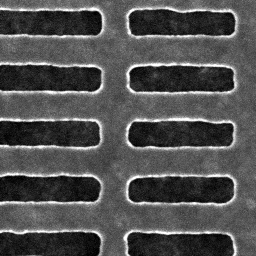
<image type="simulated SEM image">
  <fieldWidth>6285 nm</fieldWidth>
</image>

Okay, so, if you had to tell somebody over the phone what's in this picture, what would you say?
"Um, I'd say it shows holes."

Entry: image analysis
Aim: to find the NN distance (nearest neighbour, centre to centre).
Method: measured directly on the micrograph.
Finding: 1360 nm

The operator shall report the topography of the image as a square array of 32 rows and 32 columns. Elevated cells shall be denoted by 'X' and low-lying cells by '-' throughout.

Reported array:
XXXXXXXXXXXXXXXXXXXXXXXXXXXXXXXX
------------XXXX------XX-----XXX
-------------XXX-------------XXX
-------------XXX-------------XXX
XXXXXXX-----XXXXX-XXXXXXXX--XXXX
XXXXXXXXXXXXXXXXXXXXXXXXXXXXXXXX
XXXXXXXXXXXXXXXXXXXXXXXXXXXXXXXX
XXXXXXXXXXXXXXXXXXXXXXXXXXXXXXXX
------------XXXXX------------XXX
-------------XXX-------------XXX
-------------XXX-------------XXX
XXXXXXXXX--XXXXXX------XXX--XXXX
XXXXXXXXXXXXXXXXXXXXXXXXXXXXXXXX
XXXXXXXXXXXXXXXXXXXXXXXXXXXXXXXX
XXXXXXXXXXXXXXXXXXXXXXXXXXXXXXXX
------------XXXX-------------XXX
-------------XXX-------------XXX
-------------XXX-------------XXX
XXXXXXXXX-XXXXXXXXXXXXXXXXXXXXXX
XXXXXXXXXXXXXXXXXXXXXXXXXXXXXXXX
XXXXXXXXXXXXXXXXXXXXXXXXXXXXXXXX
XXXXXXXXXXXXXXXXXXXXXXXXXXXXXXXX
------------XXXXX------------XXX
-------------XXX-------------XXX
------------XXXX-------------XXX
XXXXXXXXXXXXXXXXXXXXXXXXXXXXXXXX
XXXXXXXXXXXXXXXXXXXXXXXXXXXXXXXX
XXXXXXXXXXXXXXXXXXXXXXXXXXXXXXXX
XXXXXXXXXXXXXXXXXXXXXXXXXXXXXXXX
------------XXXX-------------XXX
-------------XXX-------------XXX
------------XXXX-------------XXX